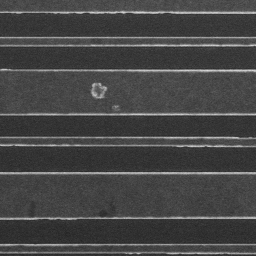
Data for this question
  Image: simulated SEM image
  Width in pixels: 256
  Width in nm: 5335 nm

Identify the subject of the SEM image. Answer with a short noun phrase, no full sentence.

lines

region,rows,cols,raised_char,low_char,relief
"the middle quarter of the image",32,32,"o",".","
................................
................................
oooooooooooooooooooooooooooooooo
oooooooooooooooooooooooooooooooo
oooooooooooooooooooooooooooooooo
oooooooooooooooooooooooooooooooo
oooooooooooooooooooooooooooooooo
oooooooooooooooooooooooooooooooo
oooooooooooooooooooooooooooooooo
oooooooooooooooooooooooooooooooo
oooooooooooooooooooooooooooooooo
oooooooooooooooooooooooooooooooo
oooooooooooooooooooooooooooooooo
................................
................................
................................
................................
................................
oooooooooooooooooooooooooooooooo
oooooooooooooooooooooooooooooooo
............................oo.o
................................
................................
................................
................................
................................
................................
oooooooooooooooooooooooooooooooo
oooooooooooooooooooooooooooooooo
oooooooooooooooooooooooooooooooo
oooooooooooooooooooooooooooooooo
oooooooooooooooooooooooooooooooo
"